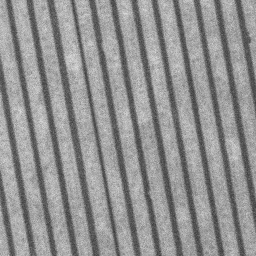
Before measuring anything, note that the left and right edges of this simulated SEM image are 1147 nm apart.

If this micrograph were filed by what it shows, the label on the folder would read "parallel lines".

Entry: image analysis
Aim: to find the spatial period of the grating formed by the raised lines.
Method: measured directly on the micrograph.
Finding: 92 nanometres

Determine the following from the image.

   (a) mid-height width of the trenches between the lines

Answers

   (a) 35.8 nanometres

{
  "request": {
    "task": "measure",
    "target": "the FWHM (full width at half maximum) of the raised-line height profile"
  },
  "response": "55.1 nm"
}